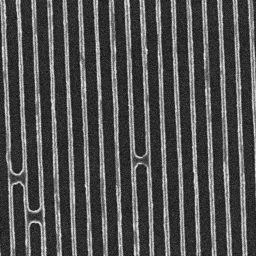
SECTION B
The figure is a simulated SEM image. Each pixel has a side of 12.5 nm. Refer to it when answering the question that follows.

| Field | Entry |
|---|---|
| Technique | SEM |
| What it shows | parallel lines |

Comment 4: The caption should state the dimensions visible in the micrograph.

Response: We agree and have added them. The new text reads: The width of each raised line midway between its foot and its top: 46.8 nm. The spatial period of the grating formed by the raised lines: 193 nm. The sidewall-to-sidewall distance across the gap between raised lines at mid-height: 143 nm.